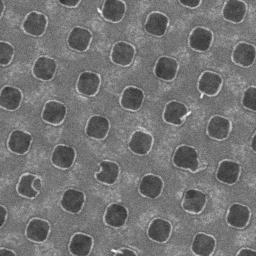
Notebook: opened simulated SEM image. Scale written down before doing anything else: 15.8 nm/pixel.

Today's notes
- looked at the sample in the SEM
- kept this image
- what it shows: a regular array of raised bodies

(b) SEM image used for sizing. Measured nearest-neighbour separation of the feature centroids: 0.709 µm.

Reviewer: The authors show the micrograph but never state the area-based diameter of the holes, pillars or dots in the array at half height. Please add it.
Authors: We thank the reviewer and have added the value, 0.392 um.